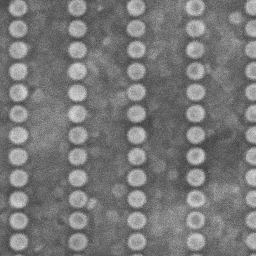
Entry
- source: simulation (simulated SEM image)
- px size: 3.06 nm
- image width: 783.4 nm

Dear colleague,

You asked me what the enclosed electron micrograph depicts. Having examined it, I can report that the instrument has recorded a regular array of raised bodies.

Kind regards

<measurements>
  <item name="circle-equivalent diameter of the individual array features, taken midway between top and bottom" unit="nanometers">48.4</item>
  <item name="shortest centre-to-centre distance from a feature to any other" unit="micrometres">0.0651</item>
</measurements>